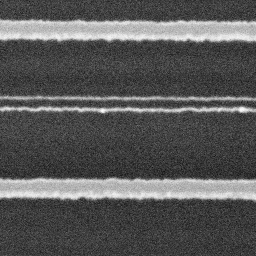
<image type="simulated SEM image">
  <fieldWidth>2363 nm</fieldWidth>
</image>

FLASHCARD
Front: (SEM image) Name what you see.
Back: lines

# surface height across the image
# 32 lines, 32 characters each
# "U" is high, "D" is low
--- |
DDDDDDDDDDDDDDDDDDDDDDDDDDDDDDDD
DDDDDDDDDDDDDDDDDDDDDDDDDDDDDDDD
DDDDDDDDDDDDDDDDDDDDDDDDDDDDDDDD
UUUUUUUUUUUUUUUUUUUUUUUUUUUUUUUU
UUUUUUUUUUUUUUUUUUUUUUUUUUUUUUUU
DDDDDDDDDDDDDDDDDDDDDDDDDDDDDDDD
DDDDDDDDDDDDDDDDDDDDDDDDDDDDDDDD
DDDDDDDDDDDDDDDDDDDDDDDDDDDDDDDD
DDDDDDDDDDDDDDDDDDDDDDDDDDDDDDDD
DDDDDDDDDDDDDDDDDDDDDDDDDDDDDDDD
DDDDDDDDDDDDDDDDDDDDDDDDDDDDDDDD
DDDDDDDDDDDDDDDDDDDDDDDDDDDDDDDD
UUUUUUUUUUUUUUUUUUUUUUUUUUUUUUUU
UUUUUUUUUUUUUUUUUUUUUUUUUUUUUUUU
DDDDDDDDDDDDDDDDDDDDDDDDDDDDDDDD
DDDDDDDDDDDDDDDDDDDDDDDDDDDDDDDD
DDDDDDDDDDDDDDDDDDDDDDDDDDDDDDDD
DDDDDDDDDDDDDDDDDDDDDDDDDDDDDDDD
DDDDDDDDDDDDDDDDDDDDDDDDDDDDDDDD
DDDDDDDDDDDDDDDDDDDDDDDDDDDDDDDD
DDDDDDDDDDDDDDDDDDDDDDDDDDDDDDDD
DDDDDDDDDDDDDDDDDDDDDDDDDDDDDDDD
UUDDUUUDUUUDDUUDDUDUDDUUDDDDDDDD
UUUUUUUUUUUUUUUUUUUUUUUUUUUUUUUU
UUUUUUUUUUUUUUUUUUUUUUUUUUUUUUUU
DDDDDDDDDDDDDDDDDDDDDDDDDDDDDDDD
DDDDDDDDDDDDDDDDDDDDDDDDDDDDDDDD
DDDDDDDDDDDDDDDDDDDDDDDDDDDDDDDD
DDDDDDDDDDDDDDDDDDDDDDDDDDDDDDDD
DDDDDDDDDDDDDDDDDDDDDDDDDDDDDDDD
DDDDDDDDDDDDDDDDDDDDDDDDDDDDDDDD
DDDDDDDDDDDDDDDDDDDDDDDDDDDDDDDD